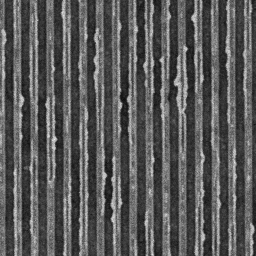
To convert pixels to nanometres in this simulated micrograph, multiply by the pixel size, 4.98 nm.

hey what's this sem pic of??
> parallel lines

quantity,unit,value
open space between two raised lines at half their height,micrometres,0.0467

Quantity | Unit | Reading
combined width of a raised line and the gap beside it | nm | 82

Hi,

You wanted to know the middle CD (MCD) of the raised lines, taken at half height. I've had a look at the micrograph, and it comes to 34.2 nm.